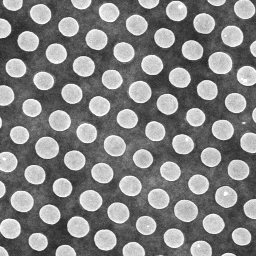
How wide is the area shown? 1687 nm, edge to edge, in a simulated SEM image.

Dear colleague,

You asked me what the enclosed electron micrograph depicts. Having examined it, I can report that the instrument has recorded a regular array of raised bodies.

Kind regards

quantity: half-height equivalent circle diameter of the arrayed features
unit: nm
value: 134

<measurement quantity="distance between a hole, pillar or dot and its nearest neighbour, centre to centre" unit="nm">194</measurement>